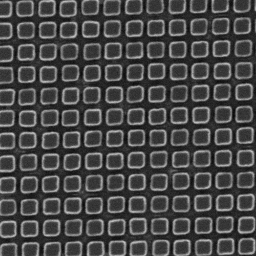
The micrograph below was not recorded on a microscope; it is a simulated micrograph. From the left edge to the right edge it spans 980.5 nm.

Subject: a regular array of raised bodies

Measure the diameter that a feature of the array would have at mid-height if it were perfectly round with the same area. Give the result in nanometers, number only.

68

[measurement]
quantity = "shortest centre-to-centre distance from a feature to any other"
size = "21.3 px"